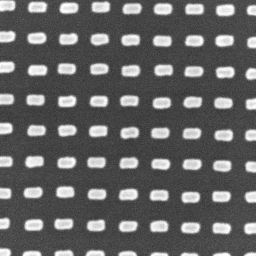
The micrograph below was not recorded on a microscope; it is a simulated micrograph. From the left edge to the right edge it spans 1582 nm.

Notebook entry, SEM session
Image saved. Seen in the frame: a regular array of raised bodies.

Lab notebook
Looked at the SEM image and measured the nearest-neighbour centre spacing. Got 188 nm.